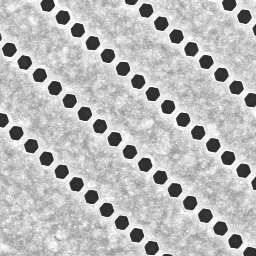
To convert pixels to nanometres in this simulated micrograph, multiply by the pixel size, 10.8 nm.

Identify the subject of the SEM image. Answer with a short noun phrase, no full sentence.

a regular array of holes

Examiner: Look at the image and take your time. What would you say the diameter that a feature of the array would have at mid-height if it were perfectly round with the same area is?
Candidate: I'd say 0.158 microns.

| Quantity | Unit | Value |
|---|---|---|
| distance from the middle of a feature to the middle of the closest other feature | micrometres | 0.213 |